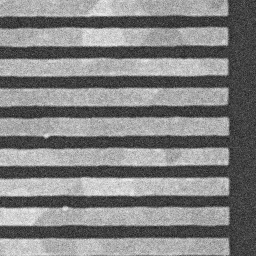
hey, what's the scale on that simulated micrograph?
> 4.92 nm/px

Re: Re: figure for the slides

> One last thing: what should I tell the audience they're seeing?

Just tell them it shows wiring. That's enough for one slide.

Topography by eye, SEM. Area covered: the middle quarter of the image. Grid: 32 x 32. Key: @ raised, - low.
@@@@@@@@@@@@@@@@@@@@@@@@@@@@@@@@
@@@@@@@@@@@@@@@@@@@@@@@@@@@@@@@@
@@@@@@@@@@@@@@@@@@@@@@@@@@@@@@@@
--------------------------------
--------------------------------
--------------------------------
@@@@@@@@@@@@@@@@@@@@@@@@@@@@@@@@
@@-@@@@@@@@@@@@@@@@@@@@@@@@@@@@@
@@-@@@@@@@@@@@@@@@@@@@@@@@@@@@@@
@@@@@@@@@@@@@@@@@@@@@@@@@@@@@@@@
--------------------------------
--------------------------------
--------------------------------
---------------------------@@---
@@@@@@@@@@@@@@@@@@@@@@@@@@@@@@@@
@@@@@@@@@@@@@@@@@@@@@@@@@@@@@@@@
@@@@@@@@@@@@@@@@@@@@@@@@@@@@@@@@
@@@@@@@@@@@@@@@@@@@@@@@@@@@@@@@@
--------------------------------
--------------------------------
--------------------------------
@@@@@@@@@@@@@@@@@@@@@@@@@@@@@@@@
@@@@@@@@@@@@@@@@@@@@@@@-@@@@@@@@
@@@@@@@@@@@@@@@@@@@@@@@@@@@@---@
@@@@@@@@@@@@@@@@@@@@@@@@@@@@@-@@
--------------------------------
--------------------------------
--------------------------------
--------------------------------
@@@@@@@@@@@@@@@-@@@@@@@@@@@@@@@-
@@@@@@@@@@@@@@@@@@@@@@@@@@@@@@-@
@@@@@@@@@@@@@@@@@@@@@@@@@@@@@--@